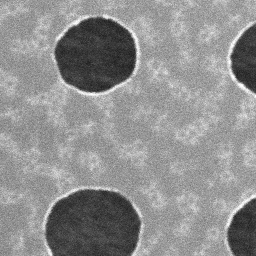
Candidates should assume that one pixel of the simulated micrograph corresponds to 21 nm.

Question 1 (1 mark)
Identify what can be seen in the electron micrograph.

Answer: holes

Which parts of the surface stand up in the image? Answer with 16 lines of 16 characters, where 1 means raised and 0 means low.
1111111111111111
1111100011111111
1111000011111110
1110000001111100
1111000011111100
1111100111111110
1111111111111111
1111111111111111
1111111111111111
1111111111111111
1111111111111111
1111111111111111
1111000011111111
1110000001111110
1110000001111100
1110000001111100